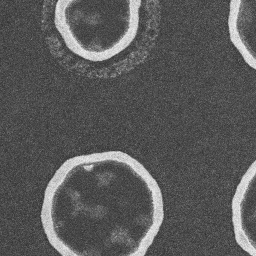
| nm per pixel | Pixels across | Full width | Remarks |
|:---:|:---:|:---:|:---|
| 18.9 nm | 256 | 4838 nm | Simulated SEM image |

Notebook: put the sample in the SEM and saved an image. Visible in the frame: raised bodies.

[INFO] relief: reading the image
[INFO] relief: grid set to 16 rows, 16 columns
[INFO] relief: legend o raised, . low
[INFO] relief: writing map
....oooo.......o
....oooo.......o
....oooo.......o
...............o
................
................
................
................
................
................
....ooooo.......
...oooooo......o
...ooooooo.....o
...ooooooo.....o
...ooooooo.....o
....ooooo.......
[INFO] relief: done